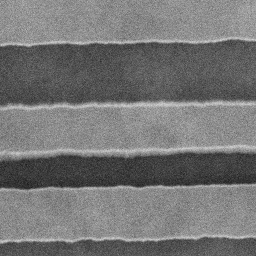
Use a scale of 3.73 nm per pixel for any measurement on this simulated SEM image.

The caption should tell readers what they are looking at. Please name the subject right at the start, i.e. lines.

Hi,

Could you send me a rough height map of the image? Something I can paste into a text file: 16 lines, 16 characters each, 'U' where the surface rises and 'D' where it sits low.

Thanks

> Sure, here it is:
UUUUUUUUUUUUUUUU
UUUUUUUUUUUUUUUU
UUUUUUUUUUUUUUDU
DDDDDDDDDDDDDDDD
DDDDDDDDDDDDDDDD
DDDDDDDDDDDDDDDD
DDDDDDDDDDDDDUUD
UUUUUUUUUUUUUUUU
UUUUUUUUUUUUUUUU
UUUUUUUUUUUDDDDD
DDDDDDDDDDDDDDDD
DDDDDDDDDDDDDDDD
UUUUUUUUUUUUUUUU
UUUUUUUUUUUUUUUU
UUUUUUUUUUUUUUUU
DDDDDDDDDDDDDDDD